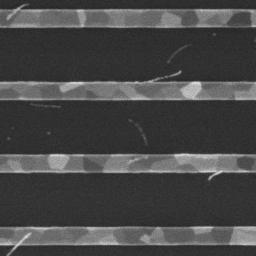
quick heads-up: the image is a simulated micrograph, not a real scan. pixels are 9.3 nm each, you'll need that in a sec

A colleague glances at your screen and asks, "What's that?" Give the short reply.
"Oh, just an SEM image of wiring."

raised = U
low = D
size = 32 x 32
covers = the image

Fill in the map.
DDDDDDDDDDDDDDDDDDDDDDDDDDDDDDDD
UUUUUUUUUUUUUUUUUUUUUUUUUUUUUUUU
UUUUUUUUUUUUUUUUUUUUUUUUUUUUUUUU
DDDDDDDDDDDDDDDDDDDDDDDDDDDDDDDD
DDDDDDDDDDDDDDDDDDDDDDDDDDDDDDDD
DDDDDDDDDDDDDDDDDDDDDDDDDDDDDDDD
DDDDDDDDDDDDDDDDDDDDDDDDDDDDDDDD
DDDDDDDDDDDDDDDDDDDDDDDDDDDDDDDD
DDDDDDDDDDDDDDDDDDDDDDDDDDDDDDDD
DDDDDDDDDDDDDDDDDDDDDDDDDDDDDDDD
UUUUUUUUUUUUUUUUUUUUUUUUUUUUUUUU
UUUUUUUUUUUUUUUUUUUUUUUUUUUUUUUU
DDDDDDDDDDDDDDDDDDDDDDDDDDDDDDDD
DDDDDDDDDDDDDDDDDDDDDDDDDDDDDDDD
DDDDDDDDDDDDDDDDDDDDDDDDDDDDDDDD
DDDDDDDDDDDDDDDDDDDDDDDDDDDDDDDD
DDDDDDDDDDDDDDDDDDDDDDDDDDDDDDDD
DDDDDDDDDDDDDDDDDDDDDDDDDDDDDDDD
DDDDDDDDDDDDDDDDDDDDDDDDDDDDDDDD
UUUUUUUUUUUUUUUUUUUUUUUUUUUUUUUU
UUUUUUUUUUUUUUUUUUUUUUUUUUUUUUUU
UUUUDDDUUDUUUUUUUUDUUDUUUDDUDDDD
DDDDDDDDDDDDDDDDDDDDDDDDDDDDDDDD
DDDDDDDDDDDDDDDDDDDDDDDDDDDDDDDD
DDDDDDDDDDDDDDDDDDDDDDDDDDDDDDDD
DDDDDDDDDDDDDDDDDDDDDDDDDDDDDDDD
DDDDDDDDDDDDDDDDDDDDDDDDDDDDDDDD
DDDDDDDDDDDDDDDDDDDDDDDDDDDDDDDD
UUUUUDUUUUUUUUUUUUUUUUUUUUUUUUUU
UUUUUUUUUUUUUUUUUUUUUUUUUUUUUUUU
UUUUUUUUUUUUUUUUUUUUUUUUUUUUUUUU
DDDDDDDDDDDDDDDDDDDDDDDDDDDDDDDD